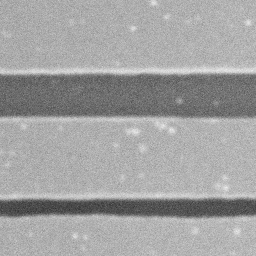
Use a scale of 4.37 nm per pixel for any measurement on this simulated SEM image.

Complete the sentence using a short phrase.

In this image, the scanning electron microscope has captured lines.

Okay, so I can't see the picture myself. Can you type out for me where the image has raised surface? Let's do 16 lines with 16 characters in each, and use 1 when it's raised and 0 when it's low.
1111111111111111
1111111111111111
1111111111111111
1111111111111111
1111111111111111
0000000000000000
0000000000000000
1111111111111111
1111111111111111
1111111111111111
1111111111111111
1111111111111111
0000000000000000
0000000000000000
1111111111111111
1111111111111111